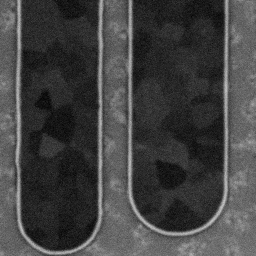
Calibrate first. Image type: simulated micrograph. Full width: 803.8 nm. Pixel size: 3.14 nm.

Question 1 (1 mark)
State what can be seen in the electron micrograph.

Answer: one or a few lines or trenches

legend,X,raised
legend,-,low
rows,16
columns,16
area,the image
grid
-XXXXX--XXXXXX--
-XXXXX--XXXXXX--
-XXXXX--XXXXXX--
-XXXXX--XXXXXX--
-XXXXX--XXXXXX--
-XXXXX--XXXXXX--
-XXXXX--XXXXXX--
-XXXXX--XXXXXX--
-XXXXX--XXXXXX--
-XXXXX--XXXXXX--
-XXXXX--XXXXXX--
-XXXXX--XXXXXX--
-XXXXX--XXXXXX--
-XXXXX---XXXXX--
-XXXXX----XX----
--XXX-----------